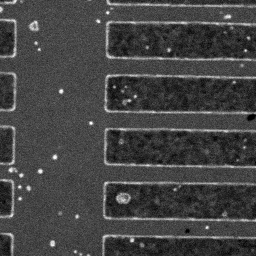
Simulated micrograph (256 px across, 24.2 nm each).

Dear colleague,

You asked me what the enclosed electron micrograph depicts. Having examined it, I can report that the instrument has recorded wiring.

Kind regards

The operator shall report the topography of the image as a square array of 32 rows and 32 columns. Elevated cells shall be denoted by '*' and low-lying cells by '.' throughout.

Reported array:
..................**************
................................
................................
**...........*******************
**...........*******************
**...........*******************
**...........*******************
................................
................................
**............***...............
**...........*******************
**...........*******************
**...........*******************
**...........*******************
................................
................................
**...........*******************
**...........*******************
**...........*******************
**...........*******************
..............******************
................................
................................
**...........*******************
**...........*******************
**...........*******************
*............*******************
..............................**
................................
*............**.................
*............*******************
*............*******************